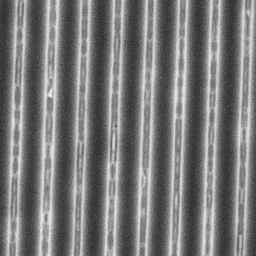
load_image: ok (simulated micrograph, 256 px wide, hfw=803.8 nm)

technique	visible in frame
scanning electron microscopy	parallel lines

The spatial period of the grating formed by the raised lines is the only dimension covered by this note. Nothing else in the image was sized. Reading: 32.5 px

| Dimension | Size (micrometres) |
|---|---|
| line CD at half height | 0.0816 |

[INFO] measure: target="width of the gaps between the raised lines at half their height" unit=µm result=0.0212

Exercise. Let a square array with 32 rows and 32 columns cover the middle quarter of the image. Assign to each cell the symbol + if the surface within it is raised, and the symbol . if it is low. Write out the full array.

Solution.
++++..++++++..++++++..++++++..++
++++..++++++..++++++..++++++..++
++++..++++++..++++++..++++++..++
++++..++++++..++++++..++++++..++
++++..++++++..++++++..++++++..++
++++..++++++..++++++..++++++..++
++++..++++++..++++++..++++++..++
++++..++++++..++++++..++++++..++
++++..++++++..++++++..++++++..++
++++..++++++..++++++..++++++..++
++++.+++++++..++++++..++++++..++
++++.+++++++..++++++..++++++..++
+++..+++++++..++++++..++++++..++
+++..+++++++..++++++..++++++..++
+++..+++++++..++++++..++++++..++
+++..+++++++.+++++++..++++++..++
+++..+++++++.+++++++..++++++..++
+++..+++++++.++++++...++++++..++
+++..++++++..++++++...++++++..++
+++..++++++..++++++...++++++..++
+++..++++++..++++++...++++++.+++
+++..++++++..++++++..+++++++.+++
+++..++++++..++++++..+++++++.+++
+++..++++++..++++++..++++++..+++
+++..++++++..++++++..++++++..+++
+++..++++++..++++++..++++++..+++
+++..++++++..++++++..++++++..+++
+++..++++++..++++++..++++++..+++
+++..++++++..++++++..++++++..+++
+++..++++++..++++++..++++++..+++
+++..++++++..++++++..++++++..+++
+++..++++++..++++++..++++++..+++